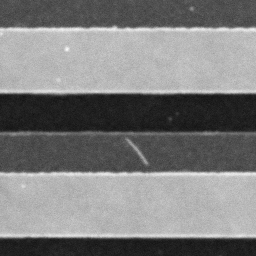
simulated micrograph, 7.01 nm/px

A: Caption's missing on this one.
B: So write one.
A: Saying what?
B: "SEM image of lines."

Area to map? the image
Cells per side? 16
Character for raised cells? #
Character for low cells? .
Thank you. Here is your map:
################
################
################
################
################
################
................
................
################
################
################
################
################
################
################
................